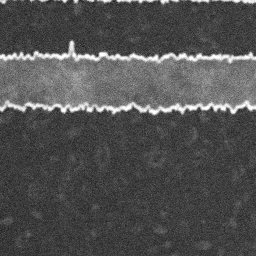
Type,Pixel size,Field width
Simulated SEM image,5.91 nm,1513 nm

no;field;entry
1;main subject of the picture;one or a few lines or trenches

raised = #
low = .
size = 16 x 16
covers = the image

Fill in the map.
................
................
................
..###...........
################
################
################
................
................
................
................
................
................
................
................
................